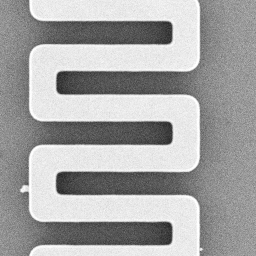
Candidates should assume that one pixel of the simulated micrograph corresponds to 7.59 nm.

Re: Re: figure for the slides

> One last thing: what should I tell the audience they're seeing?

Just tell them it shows groups of lines, slits or small figures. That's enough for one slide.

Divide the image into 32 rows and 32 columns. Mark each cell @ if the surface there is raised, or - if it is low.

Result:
----@@@@@@@@@@@@@@@@@@@@@-------
----@@@@@@@@@@@@@@@@@@@@@-------
-----@@@@@@@@@@@@@@@@@@@@-------
----------------------@@@-------
----------------------@@@-------
---------------------@@@@-------
----@@@@@@@@@@@@@@@@@@@@@-------
----@@@@@@@@@@@@@@@@@@@@@-------
----@@@@@@@@@@@@@@@@@@@@--------
----@@@-------------------------
----@@@-------------------------
----@@@-------------------------
----@@@@@@@@@@@@@@@@@@@@--------
----@@@@@@@@@@@@@@@@@@@@@-------
----@@@@@@@@@@@@@@@@@@@@@-------
---------------------@@@@-------
----------------------@@@-------
----------------------@@@-------
-----@@@@@@@@@@@@@@@@@@@@-------
----@@@@@@@@@@@@@@@@@@@@@-------
----@@@@@@@@@@@@@@@@@@@@@-------
----@@@-------------------------
----@@@-------------------------
----@@@-------------------------
----@@@@@@@@@@@@@@@-------------
----@@@@@@@@@@@@@@@@@@@@@-------
----@@@@@@@@@@@@@@@@@@@@@-------
-----@@@@@@@@@@@@@@@@@@@@-------
----------------------@@@-------
----------------------@@@-------
---------------------@@@@-------
----@@@@@@@@@@@@@@@@@@@@@-------